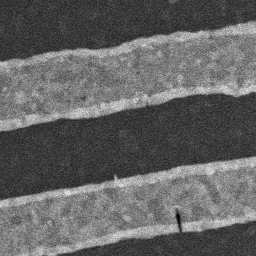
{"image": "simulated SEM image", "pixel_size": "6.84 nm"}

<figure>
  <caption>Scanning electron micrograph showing one or a few lines or trenches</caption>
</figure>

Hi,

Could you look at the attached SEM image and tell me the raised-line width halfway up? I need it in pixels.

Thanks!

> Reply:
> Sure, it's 56.2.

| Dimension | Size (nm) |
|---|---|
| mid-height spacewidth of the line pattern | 526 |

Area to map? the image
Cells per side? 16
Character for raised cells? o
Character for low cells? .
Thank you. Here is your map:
................
................
..........oooooo
...ooooooooooooo
oooooooooooooooo
oooooooooooooooo
oooooooo........
oo..............
................
................
.............ooo
.......ooooooooo
.ooooooooooooooo
oooooooooooooooo
oooooooo........
oooo............